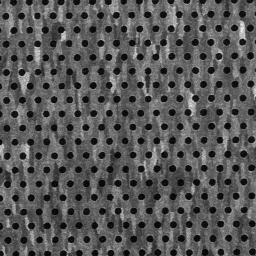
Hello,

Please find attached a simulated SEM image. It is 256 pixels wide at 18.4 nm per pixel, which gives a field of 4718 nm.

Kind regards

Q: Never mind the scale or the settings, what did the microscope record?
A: a regular array of holes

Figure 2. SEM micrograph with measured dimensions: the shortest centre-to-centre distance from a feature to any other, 288 nanometres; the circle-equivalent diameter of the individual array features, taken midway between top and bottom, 135 nm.